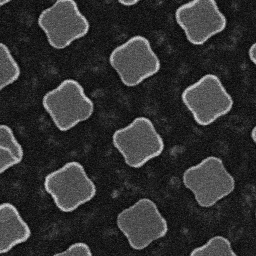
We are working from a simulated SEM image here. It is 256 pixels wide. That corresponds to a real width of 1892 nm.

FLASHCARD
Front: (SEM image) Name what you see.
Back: raised bodies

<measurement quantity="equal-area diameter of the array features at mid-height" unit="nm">335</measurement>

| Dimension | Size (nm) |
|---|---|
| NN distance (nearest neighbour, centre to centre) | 589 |